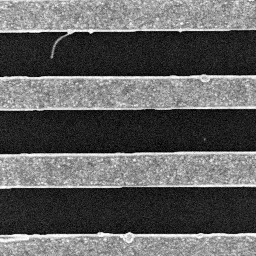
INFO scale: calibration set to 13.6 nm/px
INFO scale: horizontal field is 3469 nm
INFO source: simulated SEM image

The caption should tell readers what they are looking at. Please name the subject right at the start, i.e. lines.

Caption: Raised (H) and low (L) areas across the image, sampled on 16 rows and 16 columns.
HHHHHHHHHHHHHHHH
HHHHHHHHHHHHHHHH
LLLLLLLLLLLLLLLL
LLLLLLLLLLLLLLLL
LLLLLLLLLLLLLLLL
HHHHHHHHHHHHHHHH
HHHHHHHHHHHHHHHH
LLLLLLLLLLLLLLLL
LLLLLLLLLLLLLLLL
LLLLLLLLLLLLLLLL
HHHHHHHHHHHHHHHH
HHHHHHHHHHHHHHHH
LLLLLLLLLLLLLLLL
LLLLLLLLLLLLLLLL
LLLLLLLLLLLLLLLL
HHHHHHHHHHHHHHHH